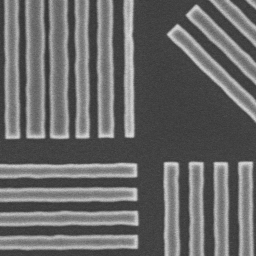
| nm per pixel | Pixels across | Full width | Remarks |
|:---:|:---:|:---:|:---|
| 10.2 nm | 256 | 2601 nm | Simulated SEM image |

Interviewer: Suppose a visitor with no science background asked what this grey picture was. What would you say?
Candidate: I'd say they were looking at groups of lines, slits or small figures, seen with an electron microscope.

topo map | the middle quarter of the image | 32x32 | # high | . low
#..###...###...##...............
#..###...###...##...............
#..###...###...##...............
#..###...###...##...............
#..###...###...##...............
#..###...###...##...............
#..###...###...##...............
#..###...###...##...............
#..###...###...##...............
#..###...###...##...............
#..###...###...##...............
#..###...###...##...............
#..###...###...##...............
#..###...###...##...............
#..###...###...##...............
#..###...###...##...............
#..###...###...##...............
#..###...###....#...............
................................
................................
................................
................................
................................
................................
................................
##################.......###....
##################.......###....
##################.......###....
.........................###....
.........................###....
.........................###....
##################.......###....